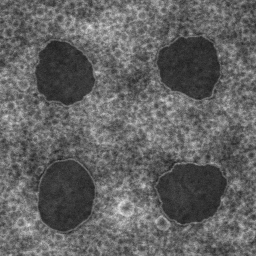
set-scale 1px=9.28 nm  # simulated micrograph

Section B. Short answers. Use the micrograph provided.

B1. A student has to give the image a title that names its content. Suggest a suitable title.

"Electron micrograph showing raised bodies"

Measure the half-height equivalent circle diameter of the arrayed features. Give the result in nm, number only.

599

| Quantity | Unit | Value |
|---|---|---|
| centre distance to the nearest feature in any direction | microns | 1.15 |